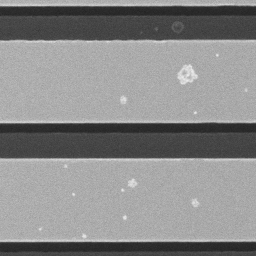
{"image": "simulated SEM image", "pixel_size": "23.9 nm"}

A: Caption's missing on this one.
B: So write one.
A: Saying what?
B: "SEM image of lines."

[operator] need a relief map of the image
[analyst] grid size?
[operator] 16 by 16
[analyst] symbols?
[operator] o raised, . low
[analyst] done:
................
................
................
oooooooooooooooo
oooooooooooooooo
oooooooooooooooo
oooooooooooooooo
oooooooooooooooo
................
................
oooooooooooooooo
oooooooooooooooo
oooooooooooooooo
oooooooooooooooo
oooooooooooooooo
................